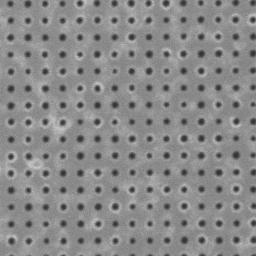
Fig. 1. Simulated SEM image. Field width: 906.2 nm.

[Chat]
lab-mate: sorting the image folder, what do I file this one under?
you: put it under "a regular array of holes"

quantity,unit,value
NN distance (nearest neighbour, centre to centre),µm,0.059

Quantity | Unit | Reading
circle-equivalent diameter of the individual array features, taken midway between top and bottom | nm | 22.2